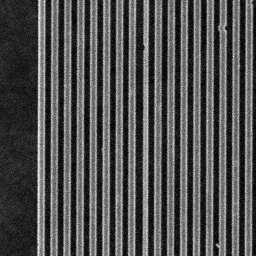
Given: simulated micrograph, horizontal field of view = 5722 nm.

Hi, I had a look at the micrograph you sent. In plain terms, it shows parallel lines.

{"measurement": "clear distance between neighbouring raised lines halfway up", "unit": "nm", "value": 162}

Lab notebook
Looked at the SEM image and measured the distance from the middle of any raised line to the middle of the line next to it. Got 290 nanometres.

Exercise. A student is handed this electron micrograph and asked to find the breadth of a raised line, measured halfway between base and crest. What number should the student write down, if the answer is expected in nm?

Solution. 140